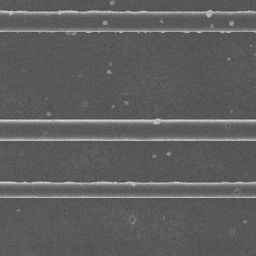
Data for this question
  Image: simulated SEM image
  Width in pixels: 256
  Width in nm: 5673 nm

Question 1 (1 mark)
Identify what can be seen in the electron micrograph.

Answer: lines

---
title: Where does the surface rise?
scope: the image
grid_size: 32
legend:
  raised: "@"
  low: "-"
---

--------------------------------
-@-----@-----------------@@-----
@@@@@@@@@@@@@@@@@@@@@@@@@@@@@@@@
@@@@@@@@@@@@@@@@@@@@@@@@@@@@@@@@
--------------------------------
--------------------------------
--------------------------------
--------------------------------
--------------------------------
--------------------------------
--------------------------------
--------------------------------
--------------------------------
--------------------------------
--------------------------------
@@@@@@@@@@@@@@@@@@@@@@@@@@@@@@@@
@@@@@@@@@@@@@@@@@@@@@@@@@@@@@@@@
@@@@@@@@@@@@@@@@@@@@@@@@@@@@@@@@
--------------------------------
--------------------------------
--------------------------------
--------------------------------
--------------------------------
@@@@@@@@@@@@@@@@@@@@@@@@@@@@@@@@
@@@@@@@@@@@@@@@@@@@@@@@@@@@@@@@@
--------------------------------
--------------------------------
--------------------------------
--------------------------------
--------------------------------
--------------------------------
--------------------------------